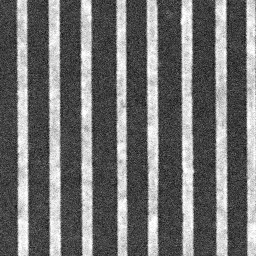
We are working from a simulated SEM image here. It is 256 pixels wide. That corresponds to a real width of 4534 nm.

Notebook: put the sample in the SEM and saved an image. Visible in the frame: parallel lines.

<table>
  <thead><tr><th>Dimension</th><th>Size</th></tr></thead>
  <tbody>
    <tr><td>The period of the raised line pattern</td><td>0.582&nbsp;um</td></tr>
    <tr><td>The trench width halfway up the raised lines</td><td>0.407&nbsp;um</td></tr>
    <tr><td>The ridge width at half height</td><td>0.155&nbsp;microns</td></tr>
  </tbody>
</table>